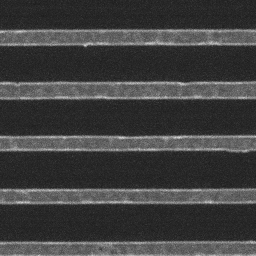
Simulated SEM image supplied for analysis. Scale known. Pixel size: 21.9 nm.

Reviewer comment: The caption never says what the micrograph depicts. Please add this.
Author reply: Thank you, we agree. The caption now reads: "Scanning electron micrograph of parallel lines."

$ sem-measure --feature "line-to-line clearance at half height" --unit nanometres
856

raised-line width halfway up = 299 nm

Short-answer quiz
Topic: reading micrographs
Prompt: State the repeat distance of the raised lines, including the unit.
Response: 1160 nanometers